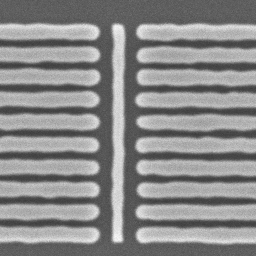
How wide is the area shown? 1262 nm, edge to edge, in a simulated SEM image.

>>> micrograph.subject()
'groups of lines, slits or small figures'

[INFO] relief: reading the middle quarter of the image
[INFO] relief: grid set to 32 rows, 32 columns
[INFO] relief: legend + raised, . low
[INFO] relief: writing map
............+++.................
.............++.....+.........++
+++++++++....++....+++++++++++++
+++++++++....++...++++++++++++++
+++++++++....++....+++++++++++++
............+++.................
............+++.................
++++++++.....++....+++++++++++++
+++++++++....++...++++++++++++++
+++++++++....++...++++++++++++++
.....++.....+++....+.+++++++++..
............+++.................
............+++.................
++++++++.....++....+++++++++++++
+++++++++....++...++++++++++++++
+++++++++....++....+++++++++++++
....+.......+++...............++
............+++.................
++++++......+++......+++.++++++.
++++++++....+++...++++++++++++++
+++++++++....++...++++++++++++++
+.++++++.....++...++++++++++++++
.............++.................
.............++.................
++++++++.....++....+++++++++++++
+++++++++...+++...++++++++++++++
+++++++++...+++...++++++++++++++
++++++++....+++....+++.+++++++++
............+++.................
............+++.................
+++++++++...+++....+++++++++++++
+++++++++...+++...++++++++++++++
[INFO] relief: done